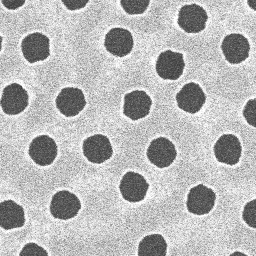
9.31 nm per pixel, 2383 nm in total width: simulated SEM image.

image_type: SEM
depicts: a regular array of holes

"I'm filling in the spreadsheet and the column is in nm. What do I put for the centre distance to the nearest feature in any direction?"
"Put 490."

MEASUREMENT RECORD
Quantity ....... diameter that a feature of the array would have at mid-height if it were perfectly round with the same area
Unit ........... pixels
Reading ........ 30.3